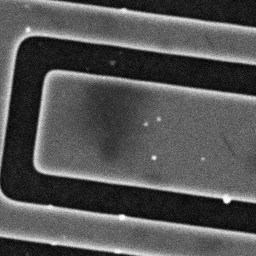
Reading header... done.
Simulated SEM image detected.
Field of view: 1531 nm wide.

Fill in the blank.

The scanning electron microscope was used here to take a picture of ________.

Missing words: groups of lines, slits or small figures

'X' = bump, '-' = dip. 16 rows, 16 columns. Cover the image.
XXXXXXX---------
XXXXXXXXXXXXXX--
X----XXXXXXXXXXX
X-----------XXXX
X--XX-----------
X--XXXXXXXXX----
X--XXXXXXXXXXXXX
--XXXXXXXXXXXXXX
--XXXXXXXXXXXXXX
--XXXXXXXXXXXXXX
--XXXXXXXXXXXXXX
-------XXXXXXXXX
X-------------XX
XXXXXXXX--------
XXXXXXXXXXXXXXX-
-----XXXXXXXXXXX